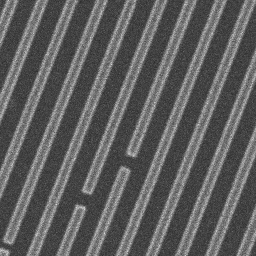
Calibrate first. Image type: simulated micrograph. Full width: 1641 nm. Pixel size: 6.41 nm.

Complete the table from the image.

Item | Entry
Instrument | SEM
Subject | parallel lines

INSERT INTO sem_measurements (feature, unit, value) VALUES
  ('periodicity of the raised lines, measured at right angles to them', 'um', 0.178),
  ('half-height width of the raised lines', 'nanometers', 55.2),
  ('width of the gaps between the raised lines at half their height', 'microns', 0.123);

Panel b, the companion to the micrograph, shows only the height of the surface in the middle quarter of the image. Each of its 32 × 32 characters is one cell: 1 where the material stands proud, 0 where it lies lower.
00110000011100000110000011100000
00110000011000001110000011000001
01110000011000001100000111000001
01100000111000001100000110000001
01100000110000011100000110000011
11000000110000011000001110000011
11000001100000111000001100000111
11000001100000110000001100000110
10000011000000110000011000000110
10000011000001110000011000001110
00000011000001100000111000001100
00000110000011100000110000011100
00000110000011000000110000011000
00001110000011000001100000011000
00001100000111000001100000111000
00001100000110000011100000110000
00011000000110000011000000110000
00011000001100000011000001100000
00011000001100000111000001100000
00110000011100000110000011100000
00110000011000001110000011000001
01100000011000001100000011000001
01100000110000001100000110000001
01100000110000000000000110000011
11000001110000000000001110000011
11000001100000000000001100000011
10000001100000110000001100000110
10000011100000110000011100000110
10000011000001110000011000001110
00000111000001100000111000001100
00000110000001100000110000001100
00000110000011000000110000011000